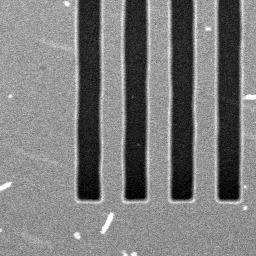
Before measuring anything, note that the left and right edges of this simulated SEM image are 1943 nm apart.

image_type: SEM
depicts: groups of lines, slits or small figures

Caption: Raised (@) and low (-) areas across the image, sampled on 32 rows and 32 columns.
@@@@@@@@@@---@@---@@@---@@@---@@
@@@@@@@@@@---@@----@@---@@@---@@
@@@@@@@@@@---@@----@@---@@@---@@
@@@@@@@@@@---@@----@@---@@@---@@
@@@@@@@@@@---@@----@@---@@@---@@
@@@@@@@@@@---@@----@@---@@@---@@
@@@@@@@@@@---@@----@@---@@@---@@
@@@@@@@@@@---@@----@@---@@@---@@
@@@@@@@@@@---@@---@@@---@@@---@@
@@@@@@@@@@---@@---@@@---@@@---@@
@@@@@@@@@@---@@---@@@---@@@---@@
@@@@@@@@@@---@@---@@@---@@@---@@
@@@@@@@@@@---@@---@@@---@@@---@@
@@@@@@@@@@---@@---@@@---@@@---@@
@@@@@@@@@@---@@---@@@---@@@---@@
@@@@@@@@@@---@@---@@@---@@@---@@
@@@@@@@@@@---@@---@@@---@@@---@@
@@@@@@@@@@---@@---@@@---@@@---@@
@@@@@@@@@@---@@---@@@---@@@---@@
@@@@@@@@@@---@@---@@@---@@@---@@
@@@@@@@@@@---@@---@@@---@@@---@@
@@@@@@@@@@---@@---@@@---@@@---@@
@@@@@@@@@@---@@---@@@---@@@---@@
@@@@@@@@@@---@@---@@@---@@@---@@
@@@@@@@@@@---@@---@@@---@@@---@@
@@@@@@@@@@@@@@@@@@@@@@@@@@@@@@@@
@@@@@@@@@@@@@@@@@@@@@@@@@@@@@@@@
@@@@@@@@@@@@@@@@@@@@@@@@@@@@@@@@
@@@@@@@@@@@@@@@@@@@@@@@@@@@@@@@@
@@@@@@@@@@@@@@@@@@@@@@@@@@@@@@@@
@@@@@@@@@@@@@@@@@@@@@@@@@@@@@@@@
@@@@@@@@@@@@@@@@@@@@@@@@@@@@@@@@